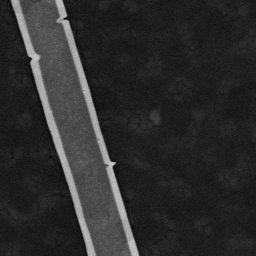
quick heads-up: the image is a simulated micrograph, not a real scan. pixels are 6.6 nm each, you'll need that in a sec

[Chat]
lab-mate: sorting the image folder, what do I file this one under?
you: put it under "one or a few lines or trenches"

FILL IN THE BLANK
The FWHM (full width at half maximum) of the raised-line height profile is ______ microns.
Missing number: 0.283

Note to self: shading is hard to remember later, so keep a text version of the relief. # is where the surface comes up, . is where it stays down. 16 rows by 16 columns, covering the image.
.###............
.###............
..##............
..###...........
..###...........
...##...........
...###..........
...###..........
...###..........
....###.........
....###.........
....###.........
.....##.........
.....###........
.....###........
......##........